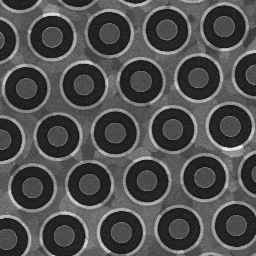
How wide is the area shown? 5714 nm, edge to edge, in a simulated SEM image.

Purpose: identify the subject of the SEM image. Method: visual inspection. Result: an array of small figures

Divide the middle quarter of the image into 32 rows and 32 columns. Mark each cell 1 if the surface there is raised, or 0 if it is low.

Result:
11000000111111100000000111111000
10000000011111000000000011110000
00000000001111000111100001110001
00011110001111000111110001110001
00011110000111000111110001110001
00011110000111000111110001110000
00011110001111000011100001111000
00001100001111000000000011111000
00000000001111100000000111111110
10000000011111110000001111111111
11000001111111111111111111111111
11111111111110111111111100000011
11111111110000001111111000000001
00111111000000000111110000000000
00011111000000000011110001111000
00001110000111100011110001111100
10001110001111100001110001111100
10001110001111100001110001111000
10001110000111100011110000111000
00001110000111000011110000000000
00001111000000000011111000000001
00011111100000000111111110000011
00111111110000011111111111111111
11111111111111111111111111111111
11111001111111111100000011111110
11100000001111110000000001111100
11000000000111110000000000111100
10000000000111100001111000111000
10001111000011100011111000111000
10001111100011100011111000011100
10001111100011100001111000111100
10001111000011110001110000111100